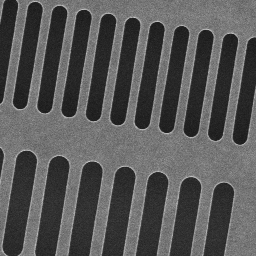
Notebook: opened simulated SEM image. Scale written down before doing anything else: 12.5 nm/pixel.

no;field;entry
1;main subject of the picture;groups of lines, slits or small figures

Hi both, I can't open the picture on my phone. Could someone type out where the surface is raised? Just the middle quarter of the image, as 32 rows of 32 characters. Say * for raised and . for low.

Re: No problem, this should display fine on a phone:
*....**....**.....**....**....**
*....**....**....***....**....**
*....**....**....***....**....**
....***....**....**....***....**
....***....**....**....***....**
....**....***....**....**....**.
....**....***....**....**....**.
....**....**.....**....**....**.
....**....**....**.....**....**.
....**....**....**....***....**.
...***....**....**....**....***.
...***....**....**....**....***.
...**....**.....**....**....**..
******...**....***....**....**..
************...***....**....**..
******************...***....**..
************************...***..
******************************..
********************************
********************************
********************************
********************************
********************************
********************************
.*****..************************
.****....***********************
.***......***....***************
.***......***.....****...*******
.***......***.....***.....****..
.***.....***......***.....****..
.***.....***......***.....***...
.***.....***.....***......***...